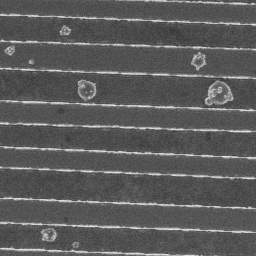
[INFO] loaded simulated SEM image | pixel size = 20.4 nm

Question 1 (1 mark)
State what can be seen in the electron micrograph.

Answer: lines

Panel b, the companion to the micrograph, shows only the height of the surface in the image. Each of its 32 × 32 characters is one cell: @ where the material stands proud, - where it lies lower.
@@@@@@@@@@@@@@@@@@@@@@@@@@@@@@@-
@@@@@@@@@@@@@@@@@@@@@@@@@@@@@@@@
----------------@@@@@@@@@@@@@@@@
--------------------------------
--------------------------------
@@@@@@@@@@@---------------------
@@@@@@@@@@@@@@@@@@@@@@@@@@@@@@@@
@@@@@@@@@@@@@@@@@@@@@@@@@@@@@@@@
-@@@@@@@@@@@@@@@@@@@@@@@@@@@@@@@
-------------------------@@@@@@@
--------------------------------
----------@@--------------@@@---
---------------------------@----
@@@@@@@@@@@@@@@@@@@@------------
@@@@@@@@@@@@@@@@@@@@@@@@@@@@@@@@
---@@@@@@@@@@@@@@@@@@@@@@@@@@@@@
--------------------------------
--------------------------------
@@------------------------------
@@@@@@@@@@@@@@@@@@@@@@@@@@@-----
@@@@@@@@@@@@@@@@@@@@@@@@@@@@@@@@
-------------@@@@@@@@@@@@@@@@@@@
--------------------------------
--------------------------------
--------------------------------
@@@@@@@@@@@@@@@@@@--------------
@@@@@@@@@@@@@@@@@@@@@@@@@@@@@@@@
@@@@@@@@@@@@@@@@@@@@@@@@@@@@@@@@
----------------@@@@@@@@@@@@@@@@
--------------------------------
--------------------------------
@@@@@@@@@@@---------------------